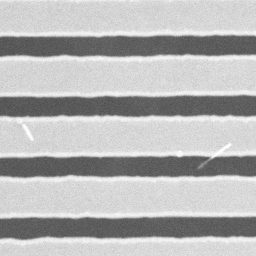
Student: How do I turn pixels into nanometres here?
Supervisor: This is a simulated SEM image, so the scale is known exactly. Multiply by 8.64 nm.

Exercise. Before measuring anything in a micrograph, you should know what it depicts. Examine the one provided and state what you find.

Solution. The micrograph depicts lines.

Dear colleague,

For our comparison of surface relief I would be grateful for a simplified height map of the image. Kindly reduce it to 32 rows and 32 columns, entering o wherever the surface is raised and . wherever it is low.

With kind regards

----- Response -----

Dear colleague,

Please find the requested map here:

oooooooooooooooooooooooooooooooo
oooooooooooooooooooooooooooooooo
oooooooooooooooooooooooooooooooo
oooooooooooooooooooooooooooooooo
oooooooooooooo..oooo.oo..o......
................................
................................
oooooooooooooooooooooooooooooooo
oooooooooooooooooooooooooooooooo
oooooooooooooooooooooooooooooooo
oooooooooooooooooooooooooooooooo
oooooooooooooooooooooooooooooooo
................................
................................
.......o....ooo.......o..oo.o...
oooooooooooooooooooooooooooooooo
oooooooooooooooooooooooooooooooo
oooooooooooooooooooooooooooooooo
oooooooooooooooooooooooooooooooo
oooooooooooooooooo.oo.o..oooo.o.
................................
................................
oooooooooooooooooooooooooooooooo
oooooooooooooooooooooooooooooooo
oooooooooooooooooooooooooooooooo
oooooooooooooooooooooooooooooooo
oooooooooooooooooooooooooooooooo
................................
................................
................................
oooooooooooooooooooooooooooooooo
oooooooooooooooooooooooooooooooo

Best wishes